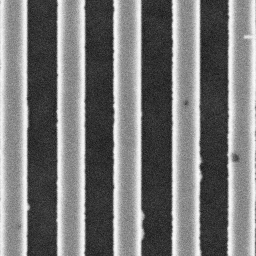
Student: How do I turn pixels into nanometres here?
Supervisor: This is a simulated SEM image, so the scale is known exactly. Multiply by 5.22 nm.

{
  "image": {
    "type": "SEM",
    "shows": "lines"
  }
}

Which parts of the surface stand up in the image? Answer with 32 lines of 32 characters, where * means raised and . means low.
***....***....****....***....***
***....***....****....***....***
***....***....****....***....***
***....***....****....***....***
***....****...****....***....***
***....****...****....***....***
***....****...****....***....***
***....****...****....***....***
***....****...****....***....***
***....****...***.....***....***
***....****...****....***....***
***....****...****....***....***
***....****...****....***....***
***....****...****....***....***
***....****...****....***....***
***....***....****....***....***
***....****...****....***....***
***....****...****....***....***
***....****...****....***....***
***....****...****....***....***
***....***....****....***....***
***....***....****....***....***
***....****...****....***....***
***....****...***.....***....***
***....****...****....***....***
***....***....****....***....***
***....****...****....***....***
***....****...****....***....***
***....****...****....***....***
***....****...****....***....***
***....****...****....***....***
***....****...****....***....***